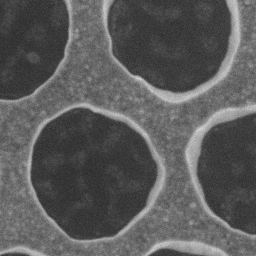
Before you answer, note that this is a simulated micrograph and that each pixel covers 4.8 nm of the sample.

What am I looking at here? holes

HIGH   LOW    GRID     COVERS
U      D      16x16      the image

DDDDUUUDDDDDDDUU
DDDDUUUDDDDDDDDU
DDDDUUUDDDDDDDDU
DDDDUUUDDDDDDDUU
DDDUUUUUDDDDDDUU
DDUUUUUUUUDDUUUU
UUUUUUUUUUUUUUUU
UUUDDDDDUUUUUUDD
UUDDDDDDDUUUUDDD
UUDDDDDDDDUUDDDD
UUDDDDDDDDUUDDDD
UUDDDDDDDDUUDDDD
UUDDDDDDDUUUUDDD
UUUDDDDDDUUUUUDD
UUUUDDDUUUUUUUUD
UUUUUUUUUUDDUUUU